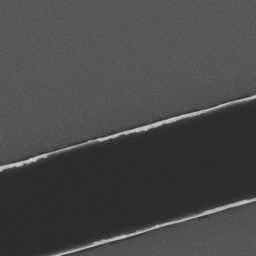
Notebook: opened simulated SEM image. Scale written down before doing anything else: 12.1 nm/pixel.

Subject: one or a few lines or trenches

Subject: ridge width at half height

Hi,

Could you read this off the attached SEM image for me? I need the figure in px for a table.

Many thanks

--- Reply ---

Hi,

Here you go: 101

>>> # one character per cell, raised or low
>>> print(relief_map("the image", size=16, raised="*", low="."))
................
................
................
................
................
................
..............**
..........******
.......*********
...*************
****************
****************
****************
************....
*********.......
*****...........